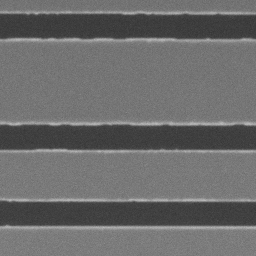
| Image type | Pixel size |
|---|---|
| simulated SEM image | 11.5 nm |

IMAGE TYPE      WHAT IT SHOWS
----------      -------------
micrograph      lines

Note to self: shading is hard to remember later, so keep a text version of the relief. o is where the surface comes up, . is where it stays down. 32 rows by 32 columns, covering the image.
oooooooooooooooooooooooooooooooo
oooooooooooooooooooooooooooooooo
................................
................................
................................
oooooooooooooooooooooooooooooooo
oooooooooooooooooooooooooooooooo
oooooooooooooooooooooooooooooooo
oooooooooooooooooooooooooooooooo
oooooooooooooooooooooooooooooooo
oooooooooooooooooooooooooooooooo
oooooooooooooooooooooooooooooooo
oooooooooooooooooooooooooooooooo
oooooooooooooooooooooooooooooooo
oooooooooooooooooooooooooooooooo
.oo...ooooooo...oooooooooooooooo
................................
................................
................................
oooooooooooooooooooooooooooooooo
oooooooooooooooooooooooooooooooo
oooooooooooooooooooooooooooooooo
oooooooooooooooooooooooooooooooo
oooooooooooooooooooooooooooooooo
oooooooooooooooooooooooooooooooo
................................
................................
................................
oooooooooooooooooooooooooooooooo
oooooooooooooooooooooooooooooooo
oooooooooooooooooooooooooooooooo
oooooooooooooooooooooooooooooooo